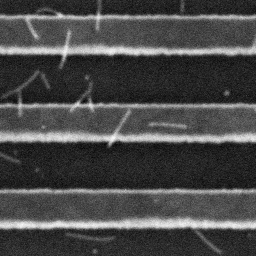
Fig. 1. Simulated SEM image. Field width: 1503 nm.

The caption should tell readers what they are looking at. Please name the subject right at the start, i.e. lines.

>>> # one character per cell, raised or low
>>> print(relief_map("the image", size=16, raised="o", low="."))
................
oooooooooooooooo
oooooooooooooooo
................
................
................
.o..ooo.........
oooooooooooooooo
oooooooooooooooo
................
................
................
oooooooooooooooo
oooooooooooooooo
................
................